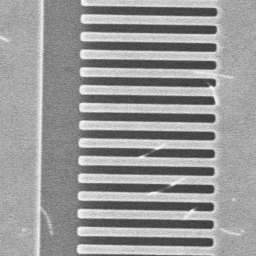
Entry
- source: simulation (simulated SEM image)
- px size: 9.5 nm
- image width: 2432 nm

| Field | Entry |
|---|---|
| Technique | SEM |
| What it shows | groups of lines, slits or small figures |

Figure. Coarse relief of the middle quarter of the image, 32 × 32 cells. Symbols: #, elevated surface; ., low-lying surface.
................................
....############################
....############################
................................
................................
................................
....############################
........########################
................................
................................
....############################
....############################
................................
................................
....######......................
....############################
..............##################
................................
................................
....############################
....############################
................................
................................
....##########################..
....############################
................................
................................
................................
....############################
....############################
................................
................................